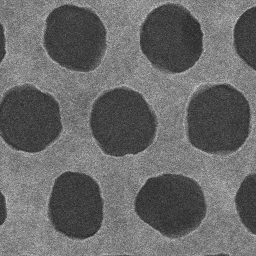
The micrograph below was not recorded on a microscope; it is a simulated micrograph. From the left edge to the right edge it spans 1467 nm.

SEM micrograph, holes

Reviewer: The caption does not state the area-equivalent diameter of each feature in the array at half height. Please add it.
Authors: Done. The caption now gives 373 nm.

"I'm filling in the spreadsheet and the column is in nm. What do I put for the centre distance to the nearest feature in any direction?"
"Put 542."